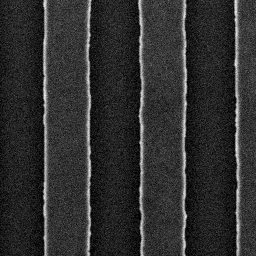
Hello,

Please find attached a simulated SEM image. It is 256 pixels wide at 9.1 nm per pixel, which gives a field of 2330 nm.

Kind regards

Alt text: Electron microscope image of lines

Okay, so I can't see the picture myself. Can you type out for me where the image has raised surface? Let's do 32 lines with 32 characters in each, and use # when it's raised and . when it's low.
......#####......######......###
......#####......######......###
......#####.......#####......###
......#####.......#####.......##
......#####.......#####.......##
......#####.......#####.......##
......#####.......#####.......##
......#####.......#####......###
......#####.......#####......###
......#####.......#####.......##
......#####.......#####.......##
......#####.......#####.......##
......#####.......#####.......##
......#####.......#####.......##
......#####.......#####.......##
......#####.......#####.......##
......#####.......#####.......##
......#####.......#####.......##
......#####.......#####.......##
......#####.......#####.......##
......#####.......#####.......##
......#####.......#####.......##
......#####.......#####.......##
......#####.......#####.......##
......#####.......#####.......##
......#####.......#####.......##
......#####.......#####.......##
......#####.......#####.......##
......#####.......#####.......##
......#####.......#####.......##
......#####.......#####.......##
......#####.......#####.......##